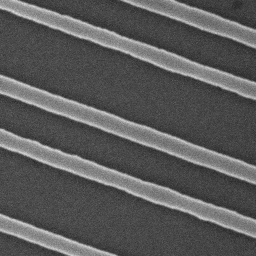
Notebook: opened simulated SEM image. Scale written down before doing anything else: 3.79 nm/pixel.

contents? lines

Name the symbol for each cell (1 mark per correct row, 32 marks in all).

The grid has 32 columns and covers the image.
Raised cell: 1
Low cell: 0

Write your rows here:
11100000000000001111111000000000
01111110000000000001111111000000
00001111110000000000001111110000
00000001111110000000000001111110
00000000011111100000000000001111
00000000000011111100000000000001
00000000000000011111100000000000
00000000000000000011111000000000
00000000000000000000111111000000
00000000000000000000000111111000
11100000000000000000000000111111
11111100000000000000000000000111
00011111100000000000000000000000
00000111111000000000000000000000
00000000111111000000000000000000
00000000000111111000000000000000
10000000000000111111000000000000
11110000000000001111111000000000
01111100000000000001111110000000
00011111110000000000001111110000
00000011111100000000000001111110
00000000011111100000000000001111
00000000000011111000000000000011
00000000000000011111100000000000
00000000000000000111111000000000
00000000000000000000111111000000
00000000000000000000000111111000
11000000000000000000000000111111
11111000000000000000000000000111
00111110000000000000000000000001
00000111110000000000000000000000
00000000111110000000000000000000